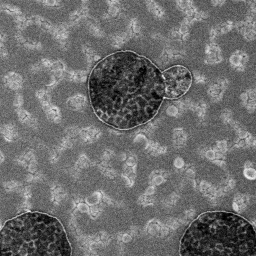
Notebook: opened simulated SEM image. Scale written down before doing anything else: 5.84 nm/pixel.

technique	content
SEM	raised bodies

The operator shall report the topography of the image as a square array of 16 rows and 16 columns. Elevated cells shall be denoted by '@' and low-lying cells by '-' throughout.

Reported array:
----------------
----------------
----------------
-------@@-------
------@@@@@@----
------@@@@@@----
------@@@@------
------@@@-------
----------------
----------------
----------------
----------------
----------------
-@@---------@@@-
@@@@--------@@@@
@@@@-------@@@@@